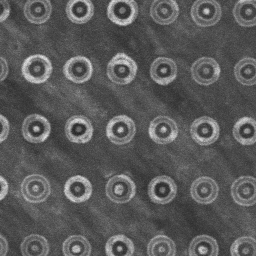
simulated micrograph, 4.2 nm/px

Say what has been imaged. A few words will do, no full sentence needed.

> a regular array of ring-shaped raised bodies with a dot in the middle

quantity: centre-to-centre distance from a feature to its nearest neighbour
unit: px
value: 41.7